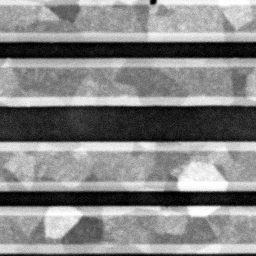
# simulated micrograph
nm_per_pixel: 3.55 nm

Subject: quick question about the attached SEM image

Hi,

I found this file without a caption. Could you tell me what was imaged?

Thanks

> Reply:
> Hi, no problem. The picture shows one or a few lines or trenches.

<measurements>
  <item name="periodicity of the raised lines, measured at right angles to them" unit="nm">251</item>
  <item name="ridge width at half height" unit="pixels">37.6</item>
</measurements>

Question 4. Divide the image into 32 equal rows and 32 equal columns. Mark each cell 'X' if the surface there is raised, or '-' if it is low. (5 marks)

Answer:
XXXXXXXXXXXXXXXXXXX-XXXXXXXXXXXX
XXXXXXXXXXXXXXXXXXXXXXXXXXXXXXXX
XXXXXXXXXXXXXXXXXXXXXXXXXXXXXXXX
XXXXXXXXXXXXXXXXXXXXXXXXXXXXXXXX
XXXXXXXXXXXXXXXXXXXXXXXXXXXXXXXX
--------------------------------
--------------------------------
--------------------------------
XXXXXXXXXXXXXXXXXXXXXXXXXXXXXXXX
XXXXXXXXXXXXXXXXXXXXXXXXXXXXXXXX
XXXXXXXXXXXXXXXXXXXXXXXXXXXXXXXX
XXXXXXXXXXXXXXXXXXXXXXXXXXXXXXXX
XXXXXXXXXXXXXXXXXXXXXXXXXXXXXXXX
--------------------------------
--------------------------------
--------------------------------
--------------------------------
--------------------------------
XXXXXXXXXXXXXXXXXXXXXXXXXXXXXXXX
XXXXXXXXXXXXXXXXXXXXXXXXXXXXXXXX
XXXXXXXXXXXXXXXXXXXXXXXXXXXXXXXX
XXXXXXXXXXXXXXXXXXXXXXXXXXXXXXXX
XXXXXXXXXXXXXXXXXXXXXXXXXXXXXXXX
--------------------------------
--------------------------------
--------------------------------
XXXXXXXXXXXXXXXXXXXXXXXXXXXXXXXX
XXXXXXXXXXXXXXXXXXXXXXXXXXXXXXXX
XXXXXXXXXXXXXXXXXXXXXXXXXXXXXXXX
XXXXXXXXXXXXXXXXXXXXXXXXXXXXXXXX
XXXXXXXXXXXXXXXXXXXXXXXXXXXXXXXX
--------------------------------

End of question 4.